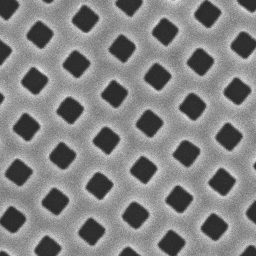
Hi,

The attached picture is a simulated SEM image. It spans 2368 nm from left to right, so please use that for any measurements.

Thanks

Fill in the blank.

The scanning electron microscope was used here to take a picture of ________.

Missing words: a regular array of holes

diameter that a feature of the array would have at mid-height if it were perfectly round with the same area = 234 nm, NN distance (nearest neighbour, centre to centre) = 45.8 pixels